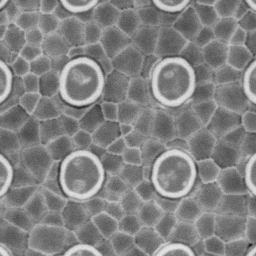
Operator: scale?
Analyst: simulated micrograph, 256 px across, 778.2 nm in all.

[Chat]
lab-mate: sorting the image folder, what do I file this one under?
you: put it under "raised bodies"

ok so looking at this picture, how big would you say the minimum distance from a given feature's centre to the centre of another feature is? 280 nm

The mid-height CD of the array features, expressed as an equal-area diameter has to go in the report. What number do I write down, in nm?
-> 127